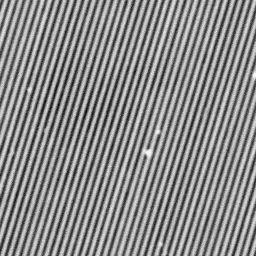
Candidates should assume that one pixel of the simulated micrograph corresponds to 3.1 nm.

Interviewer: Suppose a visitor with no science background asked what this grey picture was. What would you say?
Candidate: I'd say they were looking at parallel lines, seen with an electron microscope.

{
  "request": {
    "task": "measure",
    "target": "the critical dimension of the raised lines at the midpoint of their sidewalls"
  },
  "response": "10.8 nm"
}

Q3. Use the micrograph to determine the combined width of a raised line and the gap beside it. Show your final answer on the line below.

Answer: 21.8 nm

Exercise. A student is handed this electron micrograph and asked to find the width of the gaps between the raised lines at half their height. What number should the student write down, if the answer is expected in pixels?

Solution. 3.48